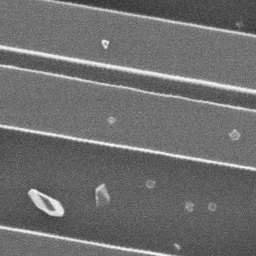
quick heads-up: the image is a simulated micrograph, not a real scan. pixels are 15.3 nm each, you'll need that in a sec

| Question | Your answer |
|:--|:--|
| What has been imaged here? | lines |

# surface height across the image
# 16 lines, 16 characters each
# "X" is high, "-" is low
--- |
XXXXXX----------
XXXXXXXXXXX-----
XXXXXXXXXXXXXXXX
XXXXXXXXXXXXXXXX
XXXXXXXXXXXXXXXX
XXXXXXXXXXXXXXXX
XXXXXXXXXXXXXXXX
XXXXXXXXXXXXXXXX
----XXXXXXXXXXXX
----------XXXXXX
----------------
----------------
----------------
----------------
XX--------------
XXXXXXX---------